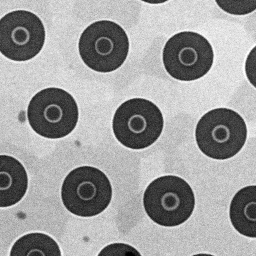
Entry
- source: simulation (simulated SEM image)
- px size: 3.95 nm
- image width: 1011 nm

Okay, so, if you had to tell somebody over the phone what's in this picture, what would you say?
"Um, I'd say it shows an array of small figures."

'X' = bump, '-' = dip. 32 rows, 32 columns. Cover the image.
XXXXXXXXXXXXXXXXXXX-XXXXXXX-----
X---XXXXXXXXXXXXXXXXXXXXXXXX----
-----XXXXXXXXXXXXXXXXXXXXXXXXXXX
------XXXXX----XXXXXXXXXXXXXXXXX
--X---XXXX------XXXXX----XXXXXXX
------XXXX--XX--XXXXX-----XXXXXX
-----XXXXX--XX--XXXX---X---XXXX-
X---XXXXXX------XXXX---X---XXXX-
XXXXXXXXXXX----XXXXXX-----XXXXX-
XXXXXXXXXXXXXXXXXXXXX----XXXXXX-
XXXXXXXXXXXXXXXXXXXXXXXXXXXXXXX-
XXXXX---XXXXXXXXXXXXXXXXXXXXXXXX
XXXX-----XXXXXXX---XXXXXXXXXXXXX
XXX---X---XXXXX-----XXXXXXX-XXXX
XXX---XX--XXXX------XXXXX-----XX
XXXX------XXXX--XX--XXXXX------X
XXXX-----XXXXX------XXXX---X---X
XXXXXXXXXXXXXXX-----XXXX---X---X
XXXXXXXXXXXXXXXX--XXXXXXX-----XX
-XXXXXXXXXXXXXXXXXXXXXXXXX---XXX
---XXXXXXXXXXXXXXXXXXXXXXXXXXXXX
---XXXXXX----XXXXXXXXXXXXXXXXXXX
X---XXXX------XXXXX----XXXXXXXXX
X--XXXXX--XX--XXXX------XXXXXX--
---XXXXX--XX--XXXX---X--XXXXX---
--XXXXXX------XXXX--XX--XXXXX--X
XXXXXXXXX----XXXXX------XXXXX--X
XXXXXXXXXXXXXXXXXXX----XXXXXX---
XXXXXXXXXXXXXXXXXXXXXXXXXXXXX---
XXX---XXXXXXXXXXXXXXXXXXXXXXXXX-
XX-----XXXXXXX--XXXXXXXXXXXXXXXX
X---X---XXXX-----XXXXXXXXXXXXXXX